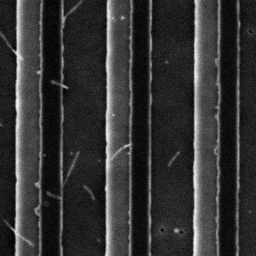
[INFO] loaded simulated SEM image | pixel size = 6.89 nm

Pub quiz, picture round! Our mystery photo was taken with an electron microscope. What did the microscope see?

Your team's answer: lines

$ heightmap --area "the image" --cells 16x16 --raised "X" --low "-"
-XXX---XX---XXX-
-XXX---XX---XXX-
-XXX---XX---XXX-
-XXX---XX---XXX-
-XXX---XX---XXX-
-XXX---XX---XXX-
-XXX---XX---XXX-
-XXX---XX---XXX-
-XXX---XX---XXX-
-XXX---XX---XXX-
-XXX---XX---XXX-
-XXX---XX---XXX-
-XXX---XX---XXX-
-XXX---XX---XXX-
-XXX---XX---XXX-
-XXX---XX---XXX-